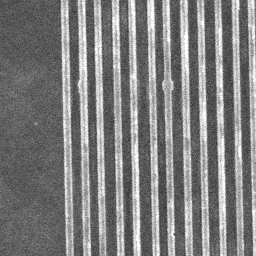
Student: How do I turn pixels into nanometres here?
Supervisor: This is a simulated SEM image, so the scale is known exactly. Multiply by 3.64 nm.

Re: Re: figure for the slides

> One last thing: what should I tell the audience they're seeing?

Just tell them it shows parallel lines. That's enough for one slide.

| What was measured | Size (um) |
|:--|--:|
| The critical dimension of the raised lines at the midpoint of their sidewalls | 0.0209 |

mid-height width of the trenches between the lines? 41.4 nanometres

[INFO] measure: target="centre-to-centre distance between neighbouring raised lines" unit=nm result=62